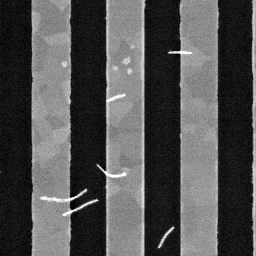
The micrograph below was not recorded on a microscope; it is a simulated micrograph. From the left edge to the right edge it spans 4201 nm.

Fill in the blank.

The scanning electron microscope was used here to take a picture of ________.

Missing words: lines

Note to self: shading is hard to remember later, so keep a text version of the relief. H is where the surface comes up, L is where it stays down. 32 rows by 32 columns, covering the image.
LLLLHHHHHLLLLHHHHHLLLLLHHHHLLLLL
LLLLHHHHHLLLLHHHHHLLLLLHHHHLLLLL
LLLLHHHHHLLLLHHHHHLLLLLHHHHLLLLL
LLLLHHHHHLLLLHHHHHLLLLLHHHHLLLLL
LLLLHHHHHLLLLHHHHHLLLLLHHHHLLLLL
LLLLHHHHHLLLLHHHHHLLLLLHHHHLLLLL
LLLLHHHHHLLLLHHHHHLLLLLHHHHLLLLL
LLLLHHHHHLLLLHHHHHLLLLLHHHHLLLLL
LLLLHHHHHLLLLHHHHHLLLLLHHHHLLLLL
LLLLHHHHHLLLLHHHHHLLLLLHHHHLLLLL
LLLLHHHHHLLLLHHHHHLLLLLHHHHLLLLL
LLLLHHHHHLLLLHHHHHLLLLLHHHHLLLLL
LLLLHHHHHLLLLHHHHHLLLLLHHHHLLLLL
LLLLHHHHHLLLLHHHHHLLLLLHHHHLLLLL
LLLLHHHHHLLLLHHHHHLLLLLHHHHLLLLL
LLLLHHHHHLLLLHHHHHLLLLLHHHHLLLLL
LLLLHHHHHLLLLHHHHHLLLLLHHHHLLLLL
LLLLHHHHHLLLLHHHHHLLLLLHHHHLLLLL
LLLLHHHHHLLLLHHHHHLLLLLHHHHLLLLL
LLLLHHHHHLLLLHHHHHLLLLLHHHHLLLLL
LLLLHHHHHLLLLHHHHHLLLLLHHHHLLLLL
LLLLHHHHHLLLLHHHHHLLLLLHHHHLLLLL
LLLLHHHHHLLLLHHHHHLLLLLHHHHLLLLL
LLLLHHHHHLLLLHHHHHLLLLLHHHHLLLLL
LLLLHHHHHLLLLHHHHHLLLLLHHHHLLLLL
LLLLHHHHHLLLLHHHHHLLLLLHHHHLLLLL
LLLLHHHHHLLLLHHHHHLLLLLHHHHLLLLL
LLLLHHHHHLLLLHHHHHLLLLLHHHHLLLLL
LLLLHHHHHLLLLHHHHHLLLLLHHHHLLLLL
LLLLHHHHHLLLLHHHHHLLLLLHHHHLLLLL
LLLLHHHHHLLLLHHHHHLLLLLHHHHLLLLL
LLLLHHHHHLLLLHHHHHLLLLLHHHHLLLLL